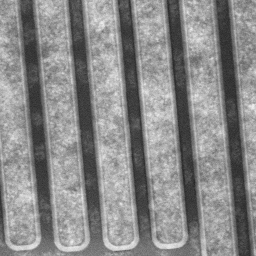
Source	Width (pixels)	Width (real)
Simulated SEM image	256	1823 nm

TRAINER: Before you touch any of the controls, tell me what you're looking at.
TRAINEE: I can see parallel lines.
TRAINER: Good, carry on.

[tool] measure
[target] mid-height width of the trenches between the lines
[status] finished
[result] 123 nanometers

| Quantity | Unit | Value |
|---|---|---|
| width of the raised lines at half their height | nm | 226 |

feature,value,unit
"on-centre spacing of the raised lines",348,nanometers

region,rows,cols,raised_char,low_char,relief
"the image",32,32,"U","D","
UUDDUUUUDDDUUUDDDUUUUDDUUUUDDUUU
UUDDUUUUDDDUUUUDDUUUUDDUUUUDDUUU
UUDDDUUUUDDUUUUDDUUUUDDUUUUDDUUU
UUDDDUUUUDDUUUUDDUUUUDDUUUUDDUUU
UUUDDUUUUDDUUUUDDUUUUDDUUUUDDUUU
UUUDDUUUUDDUUUUDDUUUUDDUUUUDDUUU
UUUDDUUUUDDUUUUDDUUUUDDUUUUDDUUU
UUUDDUUUUDDUUUUDDUUUUDDUUUUDDDUU
UUUDDUUUUDDUUUUDDUUUUDDUUUUDDDUU
UUUDDUUUUDDUUUUDDUUUUDDDUUUUDDUU
UUUDDUUUUDDUUUUDDDUUUDDDUUUUDDUU
UUUDDUUUUDDDUUUDDDUUUUDDUUUUDDUU
UUUDDUUUUDDDUUUUDDUUUUDDUUUUDDUU
UUUDDDUUUUDDUUUUDDUUUUDDUUUUDDUU
UUUDDDUUUUDDUUUUDDUUUUDDUUUUDDUU
UUUUDDUUUUDDUUUUDDUUUUDDUUUUDDUU
UUUUDDUUUUDDUUUUDDUUUUDDUUUUDDUU
UUUUDDUUUUDDUUUUDDUUUUDDUUUUDDUU
UUUUDDUUUUDDUUUUDDUUUUDDUUUUDDDU
UUUUDDUUUUDDUUUUDDUUUUDDUUUUDDDU
UUUUDDUUUUDDUUUUDDUUUUDDDUUUUDDU
UUUUDDUUUUDDUUUUDDUUUUDDDUUUUDDU
UUUUDDUUUUDDDUUUDDDUUUUDDUUUUDDU
UUUUDDUUUUDDDUUUUDDUUUUDDUUUUDDU
UUUUDDDUUUUDDUUUUDDUUUUDDUUUUDDU
UUUUDDDUUUUDDUUUUDDUUUUDDUUUUDDU
DUUUUDDUUUUDDUUUUDDUUUUDDUUUUDDU
DUUUUDDUUUUDDUUUUDDUUUUDDUUUUDDU
DUUUUDDUUUUDDUUUUDDUUUUDDUUUUDDU
DUUUUDDUUUUDDUUUUDDUUUUDDUUUUDDD
DUUUDDDUUUUDDUUUUDDDUUDDDUUUUDDD
DDDDDDDDDDDDDDDDDDDDDDDDDDUUUDDD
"